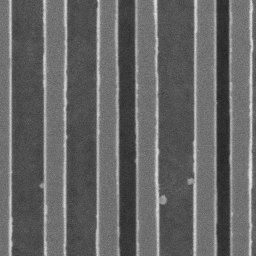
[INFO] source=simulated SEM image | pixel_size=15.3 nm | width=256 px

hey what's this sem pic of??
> lines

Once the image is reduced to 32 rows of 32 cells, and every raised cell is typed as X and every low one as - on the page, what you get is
X-----XX----XXX--XX-----XXX--XX-
X-----XX----XXX--XX-----XXX--XX-
X-----XX----XXX--XXX----XXX--XX-
X-----XX----XXX--XXX----XXX--XX-
X-----XX----XXX--XXX----XXX--XX-
X-----XX----XXX--XXX----XXX--XXX
X-----XX----XXX--XXX----XXX--XXX
X-----XX----XXX--XXX----XXX--XX-
X-----XX----XXX--XXX----XXX--XX-
X-----XX----XXX--XXX----XXX--XX-
X-----XX----XXX--XXX----XXX--XX-
X-----XX----XXX--XXX----XXX--XX-
X-----XX----XXX--XXX----XXX--XX-
X-----XX----XXX--XXX----XXX--XX-
X-----XX----XXX--XXX----XXX--XX-
X-----XX----XXX--XXX----XXX--XX-
X-----XX----XXX--XXX----XXX--XX-
X-----XX----XXX--XXX----XXX--XX-
X-----XX----XXX--XXX----XXX--XX-
X-----XX----XXX--XXX----XXX--XX-
X-----XX----XXX--XXX----XXX--XX-
X-----XX----XXX--XXX----XXX--XX-
X-----XX----XXX--XXX----XXX--XX-
X-----XX----XXX--XXX----XXX--XX-
X-----XX----XXX--XXX----XXX--XX-
X-----XX----XXX--XXX----XXX--XX-
X-----XX----XXX--XXX----XXX--XX-
X-----XX----XXX--XXX----XXX--XX-
X-----XX----XXX--XXX----XXX--XX-
X-----XX----XXX--XXX----XXX--XX-
X-----XX----XXX--XXX----XXX--XX-
X-----XX----XXX--XXX----XXX--XX-